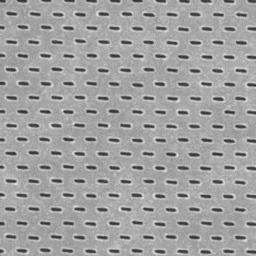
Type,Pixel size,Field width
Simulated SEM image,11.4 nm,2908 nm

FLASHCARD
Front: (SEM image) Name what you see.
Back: a regular array of holes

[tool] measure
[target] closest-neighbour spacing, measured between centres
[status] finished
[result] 199 nm